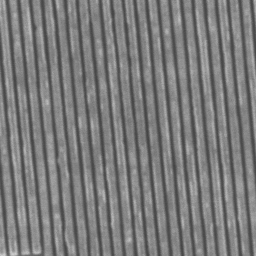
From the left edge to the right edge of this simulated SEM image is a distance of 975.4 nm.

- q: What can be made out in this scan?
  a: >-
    parallel lines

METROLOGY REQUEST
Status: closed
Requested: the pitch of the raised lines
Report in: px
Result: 11.6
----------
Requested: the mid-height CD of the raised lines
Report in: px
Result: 7.22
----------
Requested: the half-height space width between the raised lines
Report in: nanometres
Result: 17.1